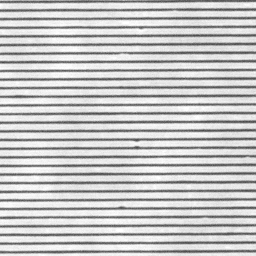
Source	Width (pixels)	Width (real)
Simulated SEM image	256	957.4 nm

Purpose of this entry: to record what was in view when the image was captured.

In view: parallel lines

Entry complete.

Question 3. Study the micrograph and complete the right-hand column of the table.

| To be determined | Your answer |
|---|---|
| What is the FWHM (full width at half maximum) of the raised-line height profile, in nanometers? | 21.5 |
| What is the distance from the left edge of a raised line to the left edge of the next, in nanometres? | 32.3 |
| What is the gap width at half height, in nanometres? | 10.7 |